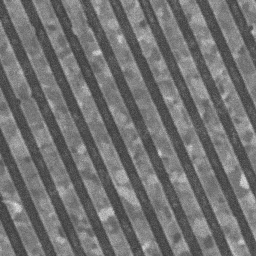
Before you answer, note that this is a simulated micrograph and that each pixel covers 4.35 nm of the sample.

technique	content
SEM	parallel lines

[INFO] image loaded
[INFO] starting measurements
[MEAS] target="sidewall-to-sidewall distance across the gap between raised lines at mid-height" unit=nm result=51.2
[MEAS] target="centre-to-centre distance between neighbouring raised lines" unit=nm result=116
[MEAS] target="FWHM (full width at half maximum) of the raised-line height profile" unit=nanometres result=64.1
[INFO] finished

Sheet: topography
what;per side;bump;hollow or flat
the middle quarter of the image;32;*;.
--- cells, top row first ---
***....****...****....***....***
****...****...****....****...***
****....****...****...****....**
.****...****...*****...****...**
.****....***....****...****....*
..****...****...****....****...*
..****...****....****...****...*
...****...****...****....****...
...****...****....****...****...
....***....****...****....***...
....****...****...*****...****..
*...****....****...****...****..
*....****...****...****....****.
**...****....***....****...****.
**....****...****...****....****
***...****...****....****...****
***....****...****...****....***
****...****...****....****...***
****...****....****...****...***
.****...****...****...*****...**
.****...****....****...****...**
..****...****...****...****....*
..****...****....***....****...*
..****....****...****...****....
...****...****...****....****...
...****....****...****...****...
....****...****...****....****..
*...****...****....****...****..
*....****...****...****...****..
**...****...****....****...****.
**....****...****...****...****.
**....****...****....***....****